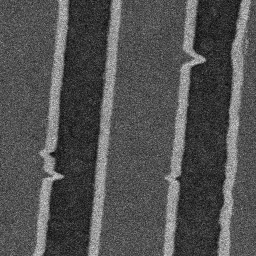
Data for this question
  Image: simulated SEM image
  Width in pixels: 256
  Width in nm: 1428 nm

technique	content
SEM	one or a few lines or trenches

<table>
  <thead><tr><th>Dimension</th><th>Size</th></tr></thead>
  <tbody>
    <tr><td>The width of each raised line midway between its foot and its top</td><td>414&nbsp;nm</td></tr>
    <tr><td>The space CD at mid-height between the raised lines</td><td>298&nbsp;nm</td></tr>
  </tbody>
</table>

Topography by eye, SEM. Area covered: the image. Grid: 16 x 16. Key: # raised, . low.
####...#####...#
####...#####...#
####...#####...#
####...#####...#
####...#####...#
###....####....#
###....####....#
###....####....#
###....####....#
###...#####....#
###...#####....#
###...#####...##
###...#####...##
###...#####...##
###...#####...##
##....#####...##